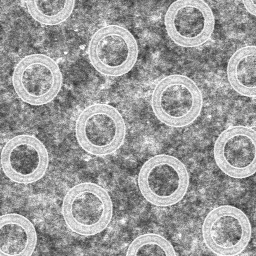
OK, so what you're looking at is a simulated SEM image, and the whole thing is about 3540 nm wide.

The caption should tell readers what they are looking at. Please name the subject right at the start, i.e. ring-shaped raised bodies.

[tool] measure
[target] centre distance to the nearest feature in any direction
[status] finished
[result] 1110 nm